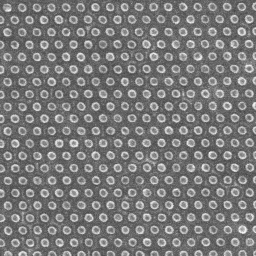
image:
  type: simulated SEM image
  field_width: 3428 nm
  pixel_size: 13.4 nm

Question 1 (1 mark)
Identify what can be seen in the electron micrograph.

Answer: a regular array of raised bodies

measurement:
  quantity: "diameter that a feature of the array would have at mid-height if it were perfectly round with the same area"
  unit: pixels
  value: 7.65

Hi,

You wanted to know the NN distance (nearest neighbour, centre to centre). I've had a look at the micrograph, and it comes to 188 nanometers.